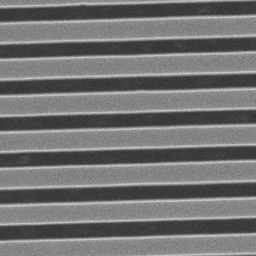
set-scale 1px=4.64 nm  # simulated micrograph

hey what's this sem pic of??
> parallel lines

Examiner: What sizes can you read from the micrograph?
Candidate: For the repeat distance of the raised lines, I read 168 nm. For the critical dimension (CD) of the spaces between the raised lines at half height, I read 70.1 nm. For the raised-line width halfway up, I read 95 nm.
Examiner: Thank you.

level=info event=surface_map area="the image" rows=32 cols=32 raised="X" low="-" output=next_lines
XXXXXXXXXXXXXX------------------
--------------------------------
-------------XXXXXXXXXXXXXXXXXXX
XXXXXXXXXXXXXXXXXXXXXXXXXXXXXXXX
XXXXXXXXXXXXXXXXXXXXXXXXXXXXXXXX
--------------------------------
--------------------------------
XXXXXXXXXXXXXXXXXXXXXXXXXXXXXXXX
XXXXXXXXXXXXXXXXXXXXXXXXXXXXXXXX
XXXXXXXXXXXXXXXXX---------------
--------------------------------
-----------------XXXXXXXXXXXXXXX
XXXXXXXXXXXXXXXXXXXXXXXXXXXXXXXX
XXXXXXXXXXXXXXXXXXXXXXXXXXXXXXXX
XXX-----------------------------
--------------------------------
--XXXXXXXXXXXXXXXXXXXXXXXXXXXXXX
XXXXXXXXXXXXXXXXXXXXXXXXXXXXXXXX
XXXXXXXXXXXXXXXXXX--------------
--------------------------------
-------------------XXXXXXXXXXXXX
XXXXXXXXXXXXXXXXXXXXXXXXXXXXXXXX
XXXXXXXXXXXXXXXXXXXXXXXXXXXXXXXX
XXX-----------------------------
--------------------------------
------XXXXXXXXXXXXXXXXXXXXXXXXXX
XXXXXXXXXXXXXXXXXXXXXXXXXXXXXXXX
XXXXXXXXXXXXXXXXXXXX------------
--------------------------------
---------------------XXXXXXXXXXX
XXXXXXXXXXXXXXXXXXXXXXXXXXXXXXXX
XXXXXXXXXXXXXXXXXXXXXXXXXXXXXXXX